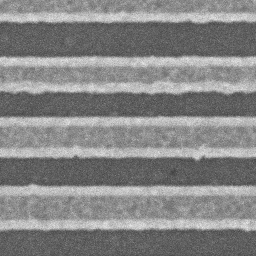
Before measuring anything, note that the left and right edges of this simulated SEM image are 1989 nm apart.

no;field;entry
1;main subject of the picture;one or a few lines or trenches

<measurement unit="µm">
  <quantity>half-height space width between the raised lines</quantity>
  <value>0.288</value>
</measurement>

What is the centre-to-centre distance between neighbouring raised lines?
517 nanometers